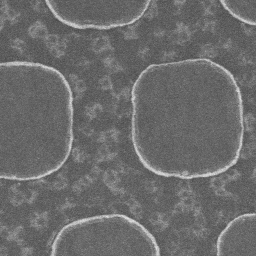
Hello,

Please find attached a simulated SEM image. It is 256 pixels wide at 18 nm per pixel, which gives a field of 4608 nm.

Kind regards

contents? raised bodies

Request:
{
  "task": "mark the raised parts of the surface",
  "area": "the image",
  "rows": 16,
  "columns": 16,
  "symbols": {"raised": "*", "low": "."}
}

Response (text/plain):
...******.....**
....****........
................
................
****.....*****..
****....*******.
****....*******.
****....*******.
****....*******.
****.....******.
****.....*****..
................
................
......**.......*
....*****.....**
...*******....**